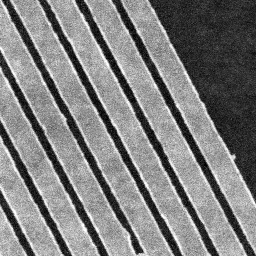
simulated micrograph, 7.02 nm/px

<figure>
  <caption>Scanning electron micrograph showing parallel lines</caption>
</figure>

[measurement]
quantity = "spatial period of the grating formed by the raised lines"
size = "228 nm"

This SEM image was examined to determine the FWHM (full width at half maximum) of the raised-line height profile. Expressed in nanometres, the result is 160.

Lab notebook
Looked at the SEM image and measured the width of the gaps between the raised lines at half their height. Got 69.7 nm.